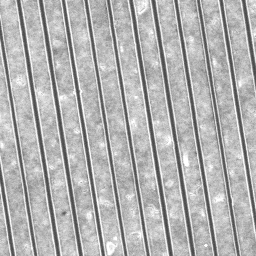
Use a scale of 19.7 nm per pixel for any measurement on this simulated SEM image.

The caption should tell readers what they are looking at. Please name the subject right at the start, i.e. parallel lines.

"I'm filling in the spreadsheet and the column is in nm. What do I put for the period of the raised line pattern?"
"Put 438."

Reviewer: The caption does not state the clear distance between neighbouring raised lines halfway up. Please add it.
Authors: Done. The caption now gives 340 nm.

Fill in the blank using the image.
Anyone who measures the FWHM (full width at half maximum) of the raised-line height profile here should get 94.8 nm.